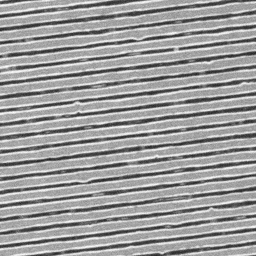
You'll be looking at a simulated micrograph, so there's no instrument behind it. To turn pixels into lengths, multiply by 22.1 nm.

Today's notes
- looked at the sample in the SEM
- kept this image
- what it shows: parallel lines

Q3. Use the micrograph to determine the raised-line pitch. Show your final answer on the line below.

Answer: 297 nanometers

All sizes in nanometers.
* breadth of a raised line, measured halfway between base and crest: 186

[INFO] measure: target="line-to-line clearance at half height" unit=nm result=112